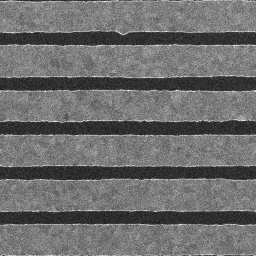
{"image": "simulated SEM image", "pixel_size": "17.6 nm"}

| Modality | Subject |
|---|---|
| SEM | parallel lines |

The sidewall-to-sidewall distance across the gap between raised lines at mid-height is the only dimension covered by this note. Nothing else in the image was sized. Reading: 242 nm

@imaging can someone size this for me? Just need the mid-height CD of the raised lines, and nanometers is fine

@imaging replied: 540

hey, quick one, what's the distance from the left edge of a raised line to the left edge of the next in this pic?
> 0.785 µm